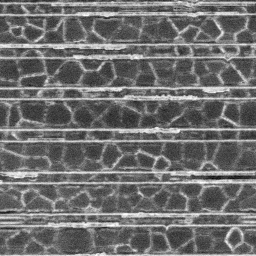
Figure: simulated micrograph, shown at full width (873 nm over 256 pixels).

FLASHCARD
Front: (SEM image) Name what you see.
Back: parallel lines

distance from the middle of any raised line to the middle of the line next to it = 144 nm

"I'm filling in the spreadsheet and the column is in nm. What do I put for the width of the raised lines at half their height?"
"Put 40.5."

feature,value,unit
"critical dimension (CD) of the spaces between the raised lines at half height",102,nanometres